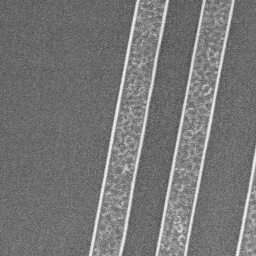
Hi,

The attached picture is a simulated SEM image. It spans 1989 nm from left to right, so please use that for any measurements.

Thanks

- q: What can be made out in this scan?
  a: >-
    one or a few lines or trenches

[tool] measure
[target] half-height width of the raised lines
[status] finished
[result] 224 nanometres